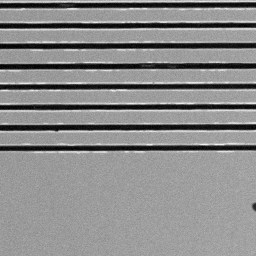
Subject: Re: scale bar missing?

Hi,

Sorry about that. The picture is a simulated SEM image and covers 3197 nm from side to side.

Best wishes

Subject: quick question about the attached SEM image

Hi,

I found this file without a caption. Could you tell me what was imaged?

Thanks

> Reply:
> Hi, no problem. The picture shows parallel lines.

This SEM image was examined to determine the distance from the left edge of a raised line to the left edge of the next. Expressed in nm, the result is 255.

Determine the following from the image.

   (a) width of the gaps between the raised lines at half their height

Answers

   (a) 73.4 nm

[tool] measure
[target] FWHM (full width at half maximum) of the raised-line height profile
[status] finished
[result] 183 nm